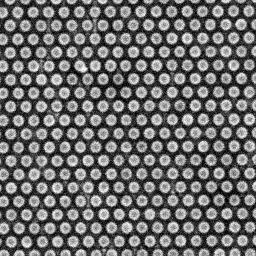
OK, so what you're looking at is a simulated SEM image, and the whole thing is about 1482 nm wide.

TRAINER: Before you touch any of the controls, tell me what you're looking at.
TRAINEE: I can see a regular array of raised bodies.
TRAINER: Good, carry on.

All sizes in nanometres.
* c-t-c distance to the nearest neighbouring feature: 88.4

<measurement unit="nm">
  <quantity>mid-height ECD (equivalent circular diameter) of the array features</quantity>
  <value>58.5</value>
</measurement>